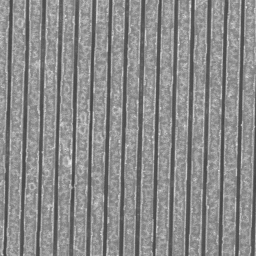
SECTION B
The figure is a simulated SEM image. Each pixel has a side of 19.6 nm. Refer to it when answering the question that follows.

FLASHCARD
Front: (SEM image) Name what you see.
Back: parallel lines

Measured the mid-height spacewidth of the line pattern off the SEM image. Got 0.0735 um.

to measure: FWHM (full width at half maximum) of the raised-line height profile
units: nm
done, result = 243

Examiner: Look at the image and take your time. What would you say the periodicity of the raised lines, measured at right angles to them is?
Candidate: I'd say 0.324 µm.